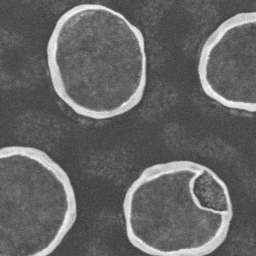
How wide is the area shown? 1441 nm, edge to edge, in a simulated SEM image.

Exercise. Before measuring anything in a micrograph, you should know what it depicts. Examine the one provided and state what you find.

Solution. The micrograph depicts raised bodies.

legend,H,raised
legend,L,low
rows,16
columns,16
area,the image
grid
LLLLLHHLLLLLLLLL
LLLLHHHHLLLLLLHH
LLLHHHHHHLLLLHHH
LLLHHHHHHLLLLHHH
LLLHHHHHHLLLLHHH
LLLLHHHHHLLLLHHH
LLLLHHHHLLLLLLHH
LLLLLLLLLLLLLLLL
LLLLLLLLLLLLLLLL
HLLLLLLLLLLLLLLL
HHHLLLLLLLLHLLLL
HHHHLLLLLHHHLLLL
HHHHLLLLHHHHLLLL
HHHHLLLLHHHHHHLL
HHHHLLLLHHHHHHLL
HHHLLLLLLHHHHLLL